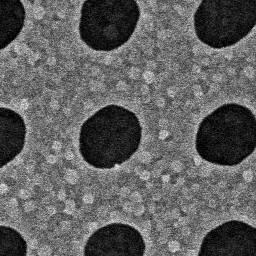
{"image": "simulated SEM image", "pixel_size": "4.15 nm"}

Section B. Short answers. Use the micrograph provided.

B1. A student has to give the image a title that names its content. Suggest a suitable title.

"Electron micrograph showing holes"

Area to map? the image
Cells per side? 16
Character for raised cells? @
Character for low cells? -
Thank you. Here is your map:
-@@@@----@@@----
-@@@@----@@@----
-@@@@---@@@@@--@
@@@@@@@@@@@@@@@@
@@@@@@@@@@@@@@@@
@@@@@@@@@@@@@@@@
@@@@@@@@@@@@@@-@
-@@@@----@@@@---
--@@@----@@@----
-@@@@---@@@@----
@@@@@@-@@@@@@@@@
@@@@@@@@@@@@@@@@
@@@@@@@@@@@@@@@@
@@@@@@@@@@@@@@@@
-@@@@@---@@@@---
--@@@----@@@----